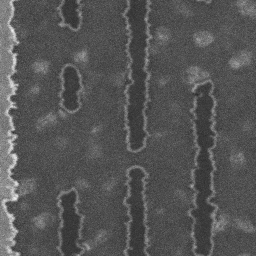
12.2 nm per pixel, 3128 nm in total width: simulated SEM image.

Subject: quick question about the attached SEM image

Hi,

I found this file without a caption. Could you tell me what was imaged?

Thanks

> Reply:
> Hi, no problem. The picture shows one or a few lines or trenches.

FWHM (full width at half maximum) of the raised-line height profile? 229 nanometers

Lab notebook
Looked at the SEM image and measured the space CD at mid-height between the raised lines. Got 48.4 pixels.